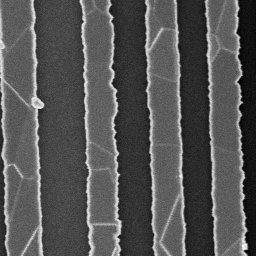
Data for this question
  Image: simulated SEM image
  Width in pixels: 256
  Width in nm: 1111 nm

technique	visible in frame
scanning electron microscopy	lines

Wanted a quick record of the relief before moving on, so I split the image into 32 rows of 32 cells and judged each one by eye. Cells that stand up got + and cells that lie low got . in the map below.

++++......++++....++++....++++..
++++......++++....++++....++++..
++++......++++....++++....++++..
++++......++++....++++....++++..
++++......++++....++++....++++..
++++......++++....++++....++++..
++++......++++....++++....++++..
+++++......+++....++++....++++..
+++++......+++....+++++...++++..
++++......++++....+++++...++++..
+++++......+++....++++....++++..
+++++......+++....++++....++++..
+++++......++++....++++...++++..
+++++......++++....++++...++++..
+++++......+++.....++++...++++..
+++++......+++.....++++...++++..
+++++......+++.....++++...++++..
+++++......+++.....++++...++++..
+++++......++++....++++...++++..
+++++......++++....++++...++++..
.++++......++++....++++....+++..
+++++......++++....++++....+++..
.++++......++++....++++....+++..
.++++......++++....++++....+++..
.++++......++++....++++....++++.
.++++......++++....++++....+++..
.++++......++++....++++....++++.
.++++......++++....++++....++++.
.++++......++++....++++....++++.
.++++......++++....++++....++++.
.++++......++++....++++....++++.
.++++......++++....++++....++++.